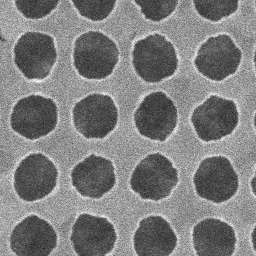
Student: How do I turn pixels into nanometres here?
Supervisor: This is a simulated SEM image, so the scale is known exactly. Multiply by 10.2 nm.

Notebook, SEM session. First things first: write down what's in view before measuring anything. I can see a regular array of holes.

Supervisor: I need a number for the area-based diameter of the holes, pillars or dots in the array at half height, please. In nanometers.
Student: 470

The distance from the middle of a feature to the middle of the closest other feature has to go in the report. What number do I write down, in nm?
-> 610